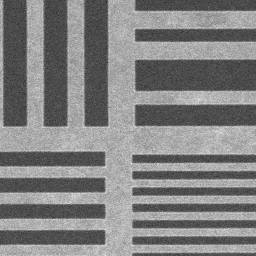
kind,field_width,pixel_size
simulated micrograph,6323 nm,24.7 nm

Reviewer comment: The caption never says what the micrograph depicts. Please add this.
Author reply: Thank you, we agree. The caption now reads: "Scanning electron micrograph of groups of lines, slits or small figures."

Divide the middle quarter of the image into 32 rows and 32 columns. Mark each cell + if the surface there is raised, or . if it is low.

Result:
+....++++++.......++++++++++++++
+....++++++.......++++++++++++++
+....++++++.......++++++++++++++
+....++++++.......++++++++++++++
+....++++++.......++++++++++++++
+....++++++.......++++++++++++++
+....++++++.......++++++++++++++
+....++++++.....................
+....++++++.....................
+....++++++.....................
+....++++++.......++++++++++++++
+....++++++.......++++++++++++++
+....++++++.......++++++++++++++
+....++++++.......++++++++++++++
+....++++++.......++++++++++++++
+....++++++.......++++++++++++++
................................
................................
................................
................................
................................
................................
++++++++++..........++++....+...
++++++++++.......+++++++++++++++
++++++++++.......+++++++++++++++
++++++++++......................
................................
.................+++++++++++++++
++++++++++.......+++++++++++++++
++++++++++......................
++++++++++......................
++++++++++.......+++++++++++++++